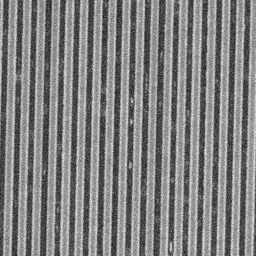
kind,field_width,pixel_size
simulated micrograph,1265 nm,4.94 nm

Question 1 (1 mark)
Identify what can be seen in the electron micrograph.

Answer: parallel lines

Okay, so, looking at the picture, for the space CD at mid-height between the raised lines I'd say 37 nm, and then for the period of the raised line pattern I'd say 70.2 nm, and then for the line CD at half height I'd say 32.7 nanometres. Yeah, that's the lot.